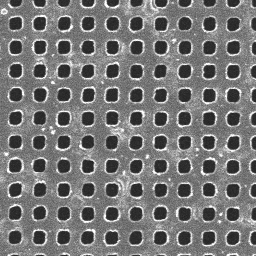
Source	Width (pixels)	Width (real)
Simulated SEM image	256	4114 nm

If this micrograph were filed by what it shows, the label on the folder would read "a regular array of holes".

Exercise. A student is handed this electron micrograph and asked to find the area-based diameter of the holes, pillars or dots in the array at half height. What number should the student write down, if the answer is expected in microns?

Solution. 0.222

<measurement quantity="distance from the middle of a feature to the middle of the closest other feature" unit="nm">378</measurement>